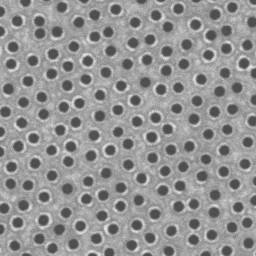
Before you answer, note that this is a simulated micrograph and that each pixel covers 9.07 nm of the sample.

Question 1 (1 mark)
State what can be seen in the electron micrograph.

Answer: a regular array of holes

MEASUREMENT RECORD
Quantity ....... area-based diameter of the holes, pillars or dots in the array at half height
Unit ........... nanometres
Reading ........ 104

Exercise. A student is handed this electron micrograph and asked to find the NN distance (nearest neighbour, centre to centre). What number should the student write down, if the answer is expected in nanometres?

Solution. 166